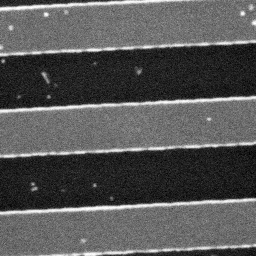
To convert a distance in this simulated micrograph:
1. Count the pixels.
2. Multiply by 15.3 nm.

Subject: lines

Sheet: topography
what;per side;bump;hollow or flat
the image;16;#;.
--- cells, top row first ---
################
################
################
................
................
................
.......#########
################
################
######..........
................
................
...............#
################
################
##############..